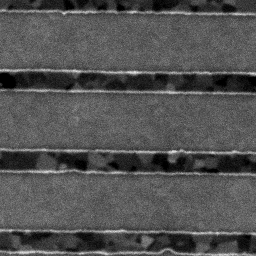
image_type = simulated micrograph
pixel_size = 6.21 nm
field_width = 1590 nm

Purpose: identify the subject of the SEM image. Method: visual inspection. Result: one or a few lines or trenches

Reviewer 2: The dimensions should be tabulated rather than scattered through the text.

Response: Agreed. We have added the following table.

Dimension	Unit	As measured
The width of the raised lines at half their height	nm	137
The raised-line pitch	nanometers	499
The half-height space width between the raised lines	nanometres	364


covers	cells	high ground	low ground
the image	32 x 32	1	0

11111111111111111111111111111111
00000001111101111111111111111111
00000000000000000000000000000000
00000000000000000000000000000000
00000000000000000000000000000000
00000000000000000000000000000000
00000000000000000000000000000000
00000000000000000000000000000000
00000000000000000000000000000000
11111111111111111111111111111111
11111111111111111111111111111111
00000000000000000111111111111111
00000000000000000000000000000000
00000000000000000000000000000000
00000000000000000000000000000000
00000000000000000000000000000000
00000000000000000000000000000000
00000000000000000000000000000000
00000000000000000000000000000000
11111111111111111111111111111111
11111111111111111111111111111111
00100111001111111111111111111111
00000000000000000000000000000000
00000000000000000000000000000000
00000000000000000000000000000000
00000000000000000000000000000000
00000000000000000000000000000000
00000000000000000000000000000000
00000000000000000000000000000000
11111111111111111111111111111111
11111111111111111111111111111111
11111111111111111111001111111111